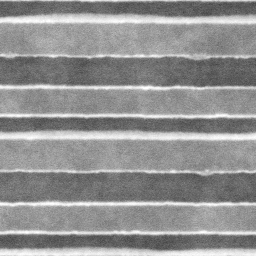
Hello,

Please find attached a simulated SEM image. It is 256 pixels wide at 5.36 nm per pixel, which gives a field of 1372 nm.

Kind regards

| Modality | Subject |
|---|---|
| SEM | lines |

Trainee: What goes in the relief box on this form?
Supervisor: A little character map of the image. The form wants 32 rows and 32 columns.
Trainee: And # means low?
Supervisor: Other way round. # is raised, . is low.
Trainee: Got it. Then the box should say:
................................
................................
#####################....#######
################################
################################
################################
################################
................................
................................
................................
................................
################################
################################
################################
...................#...####.....
................................
................................
################################
################################
################################
################################
........####......##############
................................
................................
................................
..#..###.......########.....#.#.
################################
################################
################################
................................
................................
................................